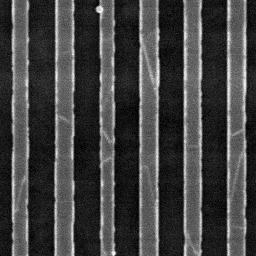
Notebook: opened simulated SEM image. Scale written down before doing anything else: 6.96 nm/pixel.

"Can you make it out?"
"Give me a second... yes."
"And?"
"lines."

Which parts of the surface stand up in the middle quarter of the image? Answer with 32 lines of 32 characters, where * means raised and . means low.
**.......***.......*****......**
**.......***.......*****......**
**.......***.......*****......**
**.......***.......*****......**
**.......***.......*****......**
**.......***.......*****......**
**.......***.......****.......**
**.......***.......****.......**
**.......***.......****.......**
**.......***.......****.......**
**.......****......****.......**
**.......****......****.......**
**.......***.......****.......**
**.......***.......****.......**
**.......***.......****.......**
**.......***.......****.......**
**.......***.......****.......**
**.......***.......****.......**
**.......****......****.......**
**.......****......****.......**
**.......***.......****.......**
**.......***.......****.......**
**.......***.......****.......**
**.......***.......****.......**
**.......***.......****.......**
**.......***.......****.......**
**.......***.......****.......**
**.......***.......****.......**
**.......***.......****.......**
**.......***.......****.......**
**.......***.......****.......**
**.......***.......****.......**